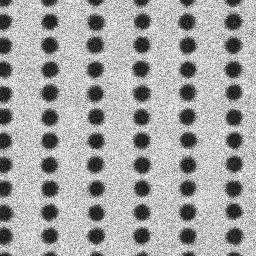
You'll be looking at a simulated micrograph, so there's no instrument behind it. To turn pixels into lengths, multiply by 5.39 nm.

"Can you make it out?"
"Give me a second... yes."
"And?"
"a regular array of holes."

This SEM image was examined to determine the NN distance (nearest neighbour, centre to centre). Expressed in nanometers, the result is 126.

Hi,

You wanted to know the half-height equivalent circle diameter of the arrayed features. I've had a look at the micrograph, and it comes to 91.1 nanometres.